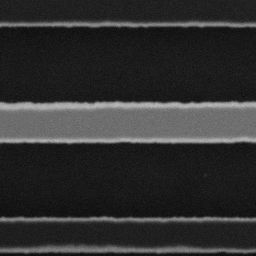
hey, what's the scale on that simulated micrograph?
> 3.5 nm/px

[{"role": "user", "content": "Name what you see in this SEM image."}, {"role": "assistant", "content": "lines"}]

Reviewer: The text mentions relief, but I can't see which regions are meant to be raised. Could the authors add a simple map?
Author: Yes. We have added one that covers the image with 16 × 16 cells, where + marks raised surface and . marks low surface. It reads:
++++++++++++++++
++++++++++++++++
................
................
................
................
.+.+++++++++++++
++++++++++++++++
++++++++++++++++
................
................
................
................
................
++++++++++++++++
++++++++++++++++